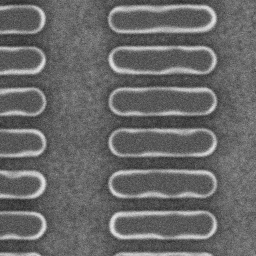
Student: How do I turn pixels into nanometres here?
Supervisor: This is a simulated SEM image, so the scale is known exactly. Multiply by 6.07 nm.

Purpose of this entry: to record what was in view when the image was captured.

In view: groups of lines, slits or small figures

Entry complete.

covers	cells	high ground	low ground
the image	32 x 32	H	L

LLLLLLLLLLLLLLLLLLLLLLLLLLLLLLLL
HHHHHLLLLLLLLLHHHHHHHHHHHHHLLLLL
HHHHHLLLLLLLLLHHHHHHHHHHHHHLLLLL
HHHHHLLLLLLLLLHHHHHHHHHHHHLLLLLL
LLLLLLLLLLLLLLLLLLLLLLLLLLLLLLLL
LLLLLLLLLLLLLLLLLLLLLLLLLLLLLLLL
HHHHHLLLLLLLLLHHHHHHHHHHHHHLLLLL
HHHHHHLLLLLLLLHHHHHHHHHHHHHLLLLL
HHHHHLLLLLLLLLHHHHHHHHHHHHHLLLLL
LLLLLLLLLLLLLLLLLLLLLLLLLLLLLLLL
LLLLLLLLLLLLLLLLLLLLLLLLLLLLLLLL
HHHHHLLLLLLLLLHHHHHHHHHHHHLLLLLL
HHHHHHLLLLLLLLHHHHHHHHHHHHHLLLLL
HHHHHLLLLLLLLLHHHHHHHHHHHHHLLLLL
LLLLLLLLLLLLLLLLLLLLLLLLLLLLLLLL
LLLLLLLLLLLLLLLLLLLLLLLLLLLLLLLL
HHHHHLLLLLLLLLHHHHHHHHHHHHLLLLLL
HHHHHHLLLLLLLLHHHHHHHHHHHHHLLLLL
HHHHHHLLLLLLLLHHHHHHHHHHHHHLLLLL
LLLLLLLLLLLLLLLHHHLLLLLLLLLLLLLL
LLLLLLLLLLLLLLLLLLLLLLLLLLLLLLLL
LLLLLLLLLLLLLLLLHHHHHHHHLLLLLLLL
HHHHHLLLLLLLLLHHHHHHHHHHHHHLLLLL
HHHHHLLLLLLLLLHHHHHHHHHHHHHLLLLL
HHHHLLLLLLLLLLLHHHLLHHHLHHLLLLLL
LLLLLLLLLLLLLLLLLLLLLLLLLLLLLLLL
LLLLLLLLLLLLLLLLLLLLLLLLLLLLLLLL
HHHHHLLLLLLLLLHHHHHHHHHHHHHLLLLL
HHHHHHLLLLLLLLHHHHHHHHHHHHHLLLLL
HHHHHLLLLLLLLLLHHHHHHHHHHHLLLLLL
LLLLLLLLLLLLLLLLLLLLLLLLLLLLLLLL
LLLLLLLLLLLLLLLLLLLLLLLLLLLLLLLL